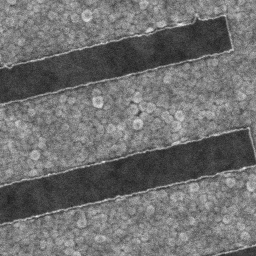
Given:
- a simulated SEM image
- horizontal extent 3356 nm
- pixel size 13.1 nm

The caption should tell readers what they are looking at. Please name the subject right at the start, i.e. one or a few lines or trenches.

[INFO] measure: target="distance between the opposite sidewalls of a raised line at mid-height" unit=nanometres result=491